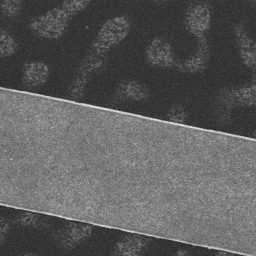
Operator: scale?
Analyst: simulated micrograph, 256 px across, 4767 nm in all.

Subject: one or a few lines or trenches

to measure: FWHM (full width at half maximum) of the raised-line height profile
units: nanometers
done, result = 2130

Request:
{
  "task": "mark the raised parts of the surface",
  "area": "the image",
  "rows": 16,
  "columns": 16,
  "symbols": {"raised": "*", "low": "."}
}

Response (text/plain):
................
................
................
................
................
................
*****...........
**********......
***************.
****************
****************
****************
****************
....************
........********
.............***